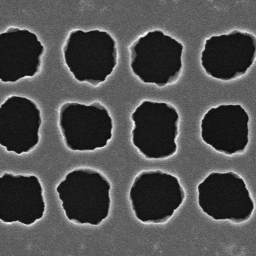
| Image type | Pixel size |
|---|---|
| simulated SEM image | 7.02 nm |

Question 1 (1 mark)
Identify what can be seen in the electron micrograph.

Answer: a regular array of holes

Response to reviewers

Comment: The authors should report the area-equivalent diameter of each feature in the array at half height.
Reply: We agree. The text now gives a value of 0.362 µm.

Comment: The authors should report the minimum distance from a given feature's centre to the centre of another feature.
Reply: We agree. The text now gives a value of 476 nanometers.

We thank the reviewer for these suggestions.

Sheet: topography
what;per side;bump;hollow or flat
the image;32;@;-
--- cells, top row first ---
@@@@@@@@@@@@@@@@@@@@@@@@@@@@@@@@
@@@@@@@@@@@@@@@@@@@@@@@@@@@@@@@@
@@@@@@@@@@@@@@@@@@@@@@@@@@@@@@@@
@@@@@@@@@@@@@@@@@@@@@@@@@@@@@@@@
----@@@@@-----@@@@---@@@@@@----@
-----@@@------@@@------@@@------
-----@@@-------@-------@@-------
-----@@@-------@-------@@-------
-----@@@@-----@@-------@@@-----@
----@@@@@----@@@@-----@@@@@--@@@
@@@@@@@@@@@@@@@@@@@--@@@@@@@@@@@
@@@@@@@@@@@@@@@@@@@@@@@@@@@@@@@@
@---@@@@@@@@@@@@@@@@@@@@@@@@@@@@
-----@@@-----@@@@----@@@@@@---@@
-----@@-------@@@-----@@@@-----@
-----@@@------@@@-----@@@------@
-----@@@------@@@-----@@@------@
-----@@@------@@@-----@@@------@
@---@@@@@---@@@@@-----@@@@@---@@
@@@@@@@@@@@@@@@@@@---@@@@@@@@@@@
@@@@@@@@@@@@@@@@@@@@@@@@@@@@@@@@
@@@@@@@@@---@@@@@@@-@@@@@@@@@@@@
-----@@@-----@@@@-----@@@@----@@
-----@@-------@@-------@@------@
-----@@-------@@-------@@------@
------@@------@@-------@@-------
-----@@@------@@@-----@@@@-----@
-----@@@@----@@@@@--@@@@@@@@@-@@
@@@@@@@@@@@@@@@@@@@@@@@@@@@@@@@@
@@@@@@@@@@@@@@@@@@@@@@@@@@@@@@@@
@@@@@@@@@@@@@@@@@@@@@@@@@@@@@@@@
@@@@@@@@@@@@@@@@@@@@@@@@@@@@@@@@